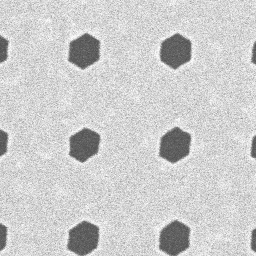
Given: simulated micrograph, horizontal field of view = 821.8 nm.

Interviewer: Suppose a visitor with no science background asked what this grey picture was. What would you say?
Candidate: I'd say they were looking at holes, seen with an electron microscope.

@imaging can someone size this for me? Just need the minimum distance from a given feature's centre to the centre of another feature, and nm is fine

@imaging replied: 292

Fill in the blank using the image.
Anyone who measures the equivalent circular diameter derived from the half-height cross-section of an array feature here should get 106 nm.